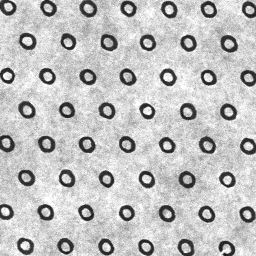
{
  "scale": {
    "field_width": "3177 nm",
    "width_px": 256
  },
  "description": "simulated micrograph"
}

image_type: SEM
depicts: a regular array of ring-shaped grooves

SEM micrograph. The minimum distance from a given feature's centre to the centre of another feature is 484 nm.